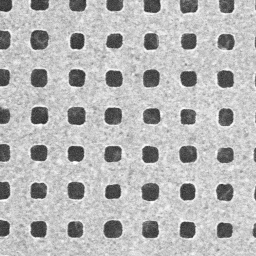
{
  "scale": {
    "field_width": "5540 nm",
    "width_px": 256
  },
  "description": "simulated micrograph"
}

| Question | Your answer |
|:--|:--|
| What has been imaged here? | a regular array of holes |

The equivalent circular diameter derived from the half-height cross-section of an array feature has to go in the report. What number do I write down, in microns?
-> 0.405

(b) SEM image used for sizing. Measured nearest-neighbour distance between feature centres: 801 nm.